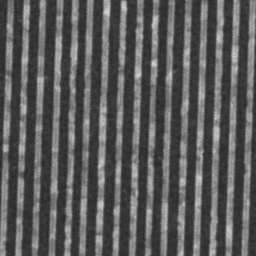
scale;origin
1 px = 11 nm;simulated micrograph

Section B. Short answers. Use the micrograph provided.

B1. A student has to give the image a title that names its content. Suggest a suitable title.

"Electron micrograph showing parallel lines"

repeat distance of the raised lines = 0.177 micrometres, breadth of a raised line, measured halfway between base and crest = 50.8 nanometres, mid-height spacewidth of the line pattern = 0.134 micrometres